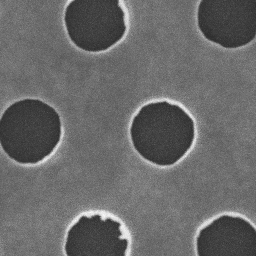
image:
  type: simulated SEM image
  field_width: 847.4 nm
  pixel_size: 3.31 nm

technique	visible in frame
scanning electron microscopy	holes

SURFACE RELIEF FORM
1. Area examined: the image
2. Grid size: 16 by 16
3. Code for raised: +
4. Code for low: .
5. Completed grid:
++++....++++....
++++....++++....
+++++..++++++...
++++++++++++++++
++++++++++++++++
++++++++++++++++
+..++++++..+++++
....++++....++++
....++++....++++
...++++++...++++
++++++++++++++++
++++++++++++++++
++++++++++++++++
++++++++++++++++
++++...++++++...
++++....++++....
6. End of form